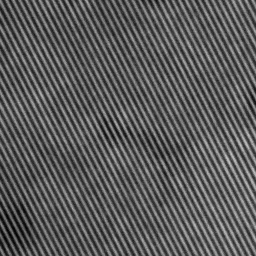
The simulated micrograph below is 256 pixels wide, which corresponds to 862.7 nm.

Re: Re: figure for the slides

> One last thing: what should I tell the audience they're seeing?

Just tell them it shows parallel lines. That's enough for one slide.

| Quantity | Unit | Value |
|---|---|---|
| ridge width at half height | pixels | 1.9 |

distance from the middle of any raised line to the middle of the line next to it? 19.9 nm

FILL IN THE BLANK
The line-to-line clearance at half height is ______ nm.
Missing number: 13.2